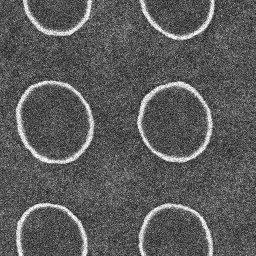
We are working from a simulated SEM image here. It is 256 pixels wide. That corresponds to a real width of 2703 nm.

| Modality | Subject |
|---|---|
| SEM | raised bodies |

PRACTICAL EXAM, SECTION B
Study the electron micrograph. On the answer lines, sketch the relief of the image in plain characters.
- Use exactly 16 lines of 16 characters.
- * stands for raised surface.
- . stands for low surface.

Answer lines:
..****...****...
..***.....***...
................
................
................
..**......**....
.****....****...
.*****...****...
.*****...****...
..***.....**....
................
................
................
..***....***....
.****....****...
.****....****...